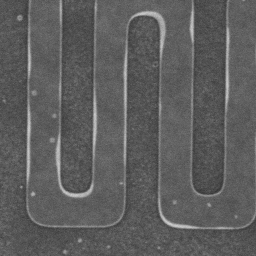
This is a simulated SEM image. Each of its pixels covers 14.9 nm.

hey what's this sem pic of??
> groups of lines, slits or small figures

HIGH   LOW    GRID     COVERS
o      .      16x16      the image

..oo..oooooo..oo
..oo..oo..oo..oo
..oo..oo..oo..oo
..oo..oo..oo..oo
..oo..oo..oo..oo
..oo..oo..oo..oo
..oo..oo..oo..oo
..oo..oo..oo..oo
..oo..oo..oo..oo
..oo..oo..oo..oo
..oo..oo..oo..oo
..oo..oo..oo..oo
..oooooo..oooooo
..oooooo..oooooo
................
................